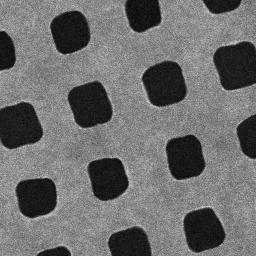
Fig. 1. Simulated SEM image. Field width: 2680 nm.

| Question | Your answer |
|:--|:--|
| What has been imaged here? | holes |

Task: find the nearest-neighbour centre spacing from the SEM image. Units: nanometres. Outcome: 785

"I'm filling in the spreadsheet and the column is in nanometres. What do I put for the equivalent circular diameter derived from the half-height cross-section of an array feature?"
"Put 440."